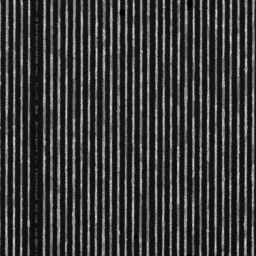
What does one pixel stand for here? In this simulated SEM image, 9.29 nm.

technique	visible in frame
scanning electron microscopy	parallel lines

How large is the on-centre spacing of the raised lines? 69.3 nm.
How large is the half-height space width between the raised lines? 54.6 nm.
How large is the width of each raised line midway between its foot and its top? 0.0139 um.